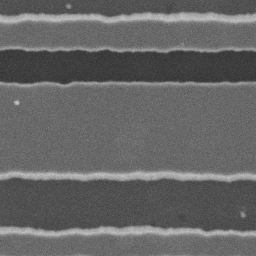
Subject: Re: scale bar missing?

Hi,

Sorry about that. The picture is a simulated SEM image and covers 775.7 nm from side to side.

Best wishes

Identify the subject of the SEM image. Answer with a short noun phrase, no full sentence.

lines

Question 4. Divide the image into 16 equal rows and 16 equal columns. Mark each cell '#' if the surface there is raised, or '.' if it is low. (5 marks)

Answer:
................
################
################
................
................
################
################
################
################
################
################
................
................
................
##..#########...
################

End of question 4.